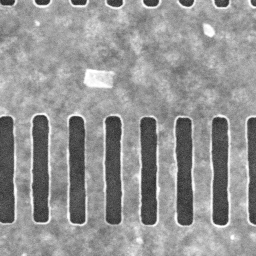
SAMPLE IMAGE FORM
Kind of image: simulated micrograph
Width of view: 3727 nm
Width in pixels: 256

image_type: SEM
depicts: holes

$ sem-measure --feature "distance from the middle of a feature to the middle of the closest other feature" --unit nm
520